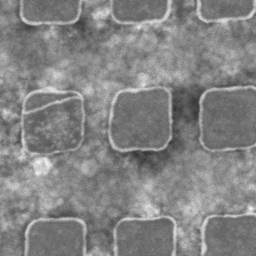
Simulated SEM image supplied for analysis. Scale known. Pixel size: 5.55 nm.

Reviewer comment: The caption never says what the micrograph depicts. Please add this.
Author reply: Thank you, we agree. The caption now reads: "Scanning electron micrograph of raised bodies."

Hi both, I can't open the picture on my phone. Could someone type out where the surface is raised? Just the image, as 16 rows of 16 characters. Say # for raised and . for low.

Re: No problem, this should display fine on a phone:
.####..####.####
..#.............
................
................
................
.........#....##
.####..####..###
.####..####.####
.####..####..###
..##............
................
................
................
..............##
..###..####..###
..###..####..###